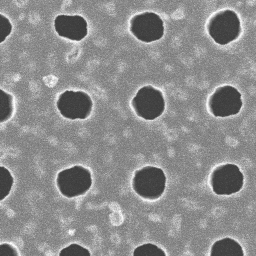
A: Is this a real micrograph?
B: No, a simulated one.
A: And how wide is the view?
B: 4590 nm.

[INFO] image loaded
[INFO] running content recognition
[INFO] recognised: a regular array of holes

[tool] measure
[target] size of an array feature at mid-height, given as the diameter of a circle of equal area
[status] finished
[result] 0.579 µm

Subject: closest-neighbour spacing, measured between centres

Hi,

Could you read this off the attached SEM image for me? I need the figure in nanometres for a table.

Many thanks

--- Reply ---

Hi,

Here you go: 1360